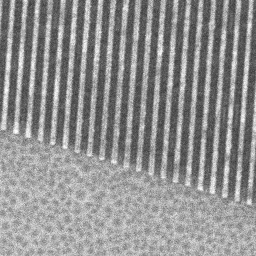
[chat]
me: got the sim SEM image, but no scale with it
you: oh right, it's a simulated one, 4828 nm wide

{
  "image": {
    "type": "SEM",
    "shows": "parallel lines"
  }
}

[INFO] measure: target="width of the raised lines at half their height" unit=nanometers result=68.2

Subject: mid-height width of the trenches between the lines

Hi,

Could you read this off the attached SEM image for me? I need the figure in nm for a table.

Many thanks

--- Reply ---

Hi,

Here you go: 167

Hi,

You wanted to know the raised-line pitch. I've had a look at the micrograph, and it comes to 0.236 um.